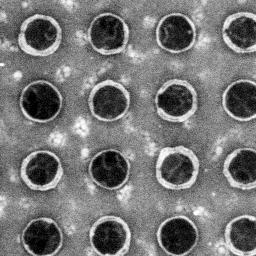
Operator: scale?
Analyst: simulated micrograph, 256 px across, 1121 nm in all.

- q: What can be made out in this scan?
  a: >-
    a regular array of raised bodies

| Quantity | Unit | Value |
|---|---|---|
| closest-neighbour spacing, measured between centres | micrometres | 0.293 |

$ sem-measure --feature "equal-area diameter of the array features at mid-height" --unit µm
0.175